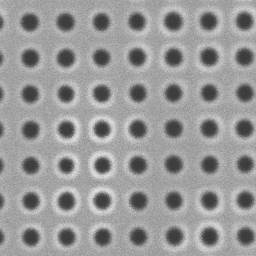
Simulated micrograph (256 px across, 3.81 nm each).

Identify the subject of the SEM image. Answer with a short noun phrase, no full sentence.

a regular array of holes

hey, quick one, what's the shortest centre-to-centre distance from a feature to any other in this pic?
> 135 nm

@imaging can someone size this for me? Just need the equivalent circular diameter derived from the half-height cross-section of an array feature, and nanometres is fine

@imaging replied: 69.8